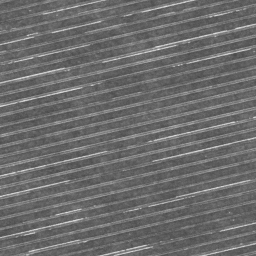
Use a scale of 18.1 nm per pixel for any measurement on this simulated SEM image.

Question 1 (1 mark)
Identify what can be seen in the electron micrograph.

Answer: parallel lines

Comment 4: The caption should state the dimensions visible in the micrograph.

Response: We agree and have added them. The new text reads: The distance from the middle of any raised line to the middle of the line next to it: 182 nanometers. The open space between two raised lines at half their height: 146 nm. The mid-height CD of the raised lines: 0.0419 um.